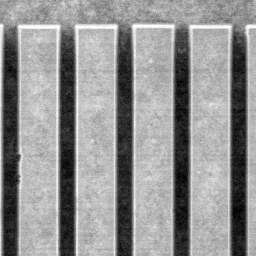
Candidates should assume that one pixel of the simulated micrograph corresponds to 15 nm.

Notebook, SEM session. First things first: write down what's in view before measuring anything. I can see parallel lines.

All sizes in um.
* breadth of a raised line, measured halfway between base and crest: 0.592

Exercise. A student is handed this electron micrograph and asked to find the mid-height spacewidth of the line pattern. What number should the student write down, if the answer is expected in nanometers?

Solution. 258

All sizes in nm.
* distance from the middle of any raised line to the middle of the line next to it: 856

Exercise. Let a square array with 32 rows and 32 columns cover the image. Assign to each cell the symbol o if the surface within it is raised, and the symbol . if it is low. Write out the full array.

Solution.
................................
................................
................................
...oooo...oooo...oooo...oooo...o
..ooooo...oooo...ooooo..ooooo..o
..ooooo...oooo...ooooo..ooooo..o
..ooooo...oooo...ooooo..ooooo..o
..ooooo...oooo...ooooo..ooooo..o
..ooooo...oooo...ooooo..ooooo..o
..ooooo...oooo...ooooo..ooooo..o
..ooooo...oooo...ooooo..ooooo..o
..ooooo...oooo...ooooo..ooooo..o
..ooooo...oooo...ooooo..ooooo..o
..ooooo...oooo...ooooo..ooooo..o
..ooooo...oooo...ooooo..ooooo..o
..ooooo...oooo...ooooo..ooooo..o
..ooooo...oooo...ooooo..ooooo..o
..ooooo...oooo...ooooo..ooooo..o
..ooooo...oooo...ooooo..ooooo..o
...oooo...oooo...ooooo..ooooo..o
..ooooo...oooo...ooooo..ooooo..o
..ooooo...oooo...ooooo..ooooo..o
...oooo...oooo...ooooo..ooooo..o
..ooooo...oooo...ooooo..ooooo..o
..ooooo...oooo...ooooo..ooooo..o
..ooooo...oooo...ooooo..ooooo..o
..ooooo...oooo...ooooo..ooooo..o
..ooooo...oooo...ooooo..ooooo..o
..ooooo...oooo...ooooo..ooooo..o
..ooooo...oooo...ooooo..ooooo..o
..ooooo...oooo...ooooo..ooooo..o
..ooooo...oooo...ooooo..ooooo..o